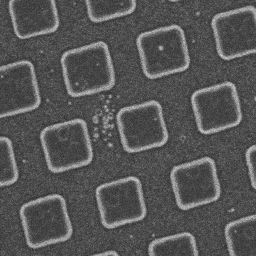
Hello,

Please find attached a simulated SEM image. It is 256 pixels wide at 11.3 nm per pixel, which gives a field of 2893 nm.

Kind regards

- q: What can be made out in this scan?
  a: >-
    a regular array of raised bodies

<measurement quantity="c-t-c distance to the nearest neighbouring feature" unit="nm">872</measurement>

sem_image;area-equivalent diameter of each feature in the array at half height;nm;540